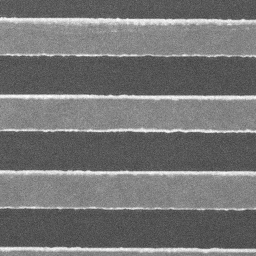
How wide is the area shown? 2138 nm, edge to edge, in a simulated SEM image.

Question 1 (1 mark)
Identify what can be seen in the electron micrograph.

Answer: lines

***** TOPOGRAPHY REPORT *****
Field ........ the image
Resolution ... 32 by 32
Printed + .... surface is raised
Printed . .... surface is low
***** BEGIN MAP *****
................................
................................
++++++++++++++++++++....+.+.....
++++++++++++++++++++++++++++++++
++++++++++++++++++++++++++++++++
++++++++++++++++++++++++++++++++
++++++++++++++++++++++++++++++++
................................
................................
................................
................................
................................
++++++++++++++++++++++++++++++++
++++++++++++++++++++++++++++++++
++++++++++++++++++++++++++++++++
++++++++++++++++++++++++++++++++
....................++.+.++++.+.
................................
................................
................................
................................
++++++++++++++++++++++++++++++++
++++++++++++++++++++++++++++++++
++++++++++++++++++++++++++++++++
++++++++++++++++++++++++++++++++
++++++++++++++++++++++++++++++++
................................
................................
................................
................................
................................
++++++++++++++++++++++++++++++++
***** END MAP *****